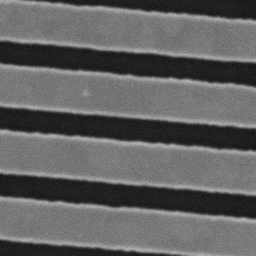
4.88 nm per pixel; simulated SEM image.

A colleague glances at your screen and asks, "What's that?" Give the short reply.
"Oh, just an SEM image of lines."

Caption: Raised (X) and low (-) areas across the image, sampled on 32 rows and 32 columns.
XXXXXXXX------------------------
XXXXXXXXXXXXXXXXXX--------------
XXXXXXXXXXXXXXXXXXXXXXXXXXXXXXX-
XXXXXXXXXXXXXXXXXXXXXXXXXXXXXXXX
XXXXXXXXXXXXXXXXXXXXXXXXXXXXXXXX
-------XXXXXXXXXXXXXXXXXXXXXXXXX
-----------------XXXXXXXXXXXXXXX
---------------------------XXXXX
XXXXXX--------------------------
XXXXXXXXXXXXXXXXX---------------
XXXXXXXXXXXXXXXXXXXXXXXXXXXXX---
XXXXXXXXXXXXXXXXXXXXXXXXXXXXXXXX
XXXXXXXXXXXXXXXXXXXXXXXXXXXXXXXX
---XXXXXXXXXXXXXXXXXXXXXXXXXXXXX
---------------XXXXXXXXXXXXXXXXX
---------------------------XXXXX
XX------------------------------
XXXXXXXXXXXXXXX-----------------
XXXXXXXXXXXXXXXXXXXXXXXXXX------
XXXXXXXXXXXXXXXXXXXXXXXXXXXXXXXX
XXXXXXXXXXXXXXXXXXXXXXXXXXXXXXXX
XXXXXXXXXXXXXXXXXXXXXXXXXXXXXXXX
-----------XXXXXXXXXXXXXXXXXXXXX
----------------------XXXXXXXXXX
--------------------------------
XXXXXXXXX-----------------------
XXXXXXXXXXXXXXXXXXXXXXX---------
XXXXXXXXXXXXXXXXXXXXXXXXXXXXXXXX
XXXXXXXXXXXXXXXXXXXXXXXXXXXXXXXX
XXXXXXXXXXXXXXXXXXXXXXXXXXXXXXXX
------XXXXXXXXXXXXXXXXXXXXXXXXXX
-------------------XXXXXXXXXXXXX